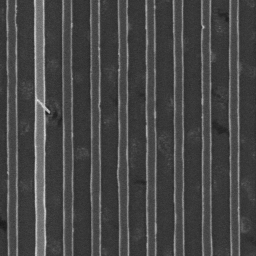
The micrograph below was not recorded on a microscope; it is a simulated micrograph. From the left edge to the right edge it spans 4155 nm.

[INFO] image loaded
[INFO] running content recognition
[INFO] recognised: parallel lines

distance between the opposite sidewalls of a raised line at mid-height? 142 nm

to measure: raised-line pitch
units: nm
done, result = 450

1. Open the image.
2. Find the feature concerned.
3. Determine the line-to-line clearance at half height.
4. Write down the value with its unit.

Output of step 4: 302 nanometres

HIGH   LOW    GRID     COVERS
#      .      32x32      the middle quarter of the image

##.....##.....##.....##.....##..
##.....##.....##.....##.....##..
##.....##.....##.....##.....##..
##.....##.....##.....##.....##..
##.....##.....##.....##.....##..
##.....##.....##.....##.....##..
##.....##.....##.....##.....##..
##.....##.....##.....##.....##..
##.....##.....##.....##.....##..
##.....##.....##.....##.....##..
##.....##.....##.....##.....##..
##.....##.....##.....##.....##..
##.....##.....##.....##.....##..
##.....##.....##.....##.....##..
##.....##.....##.....##.....##..
##.....##.....##.....##.....##..
##.....##.....##.....##.....##..
##.....##.....##.....##.....##..
##.....##.....##.....##.....##..
##.....##.....##.....##.....##..
##.....##.....##.....##.....##..
##.....##.....##.....##.....##..
##.....##.....##.....##.....##..
##.....##.....##.....##.....##..
##.....##.....##.....##.....##..
##.....##.....##.....##.....##..
##.....##....###.....##.....##..
##.....##....###.....##.....##..
##.....##....###.....##.....##..
##.....##.....##.....##.....##..
##.....##.....##.....##.....##..
##.....##.....##.....##.....##..